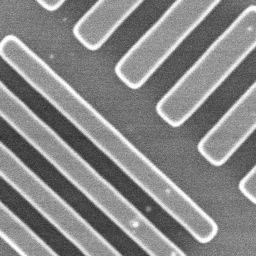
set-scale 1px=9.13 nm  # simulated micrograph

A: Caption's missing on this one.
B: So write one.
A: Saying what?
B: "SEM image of groups of lines, slits or small figures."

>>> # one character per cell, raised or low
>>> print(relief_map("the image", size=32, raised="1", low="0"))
00000111000011111000001111100000
00000000000111110000011111000001
00000000001111100000111110000011
00000000011111000001111100000111
00000000001111000011111000001111
11100000000110000111110000011111
11110000000000001111100000111110
01111000000000011111000001111100
00111100000000011111000011111000
00011110000000011110000111110000
00001111000000001100001111100000
10000111100000000000011111000001
11000011110000000000111111000011
11100001111000000000111110000111
11110000111100000000111100001111
01111100011111000000000000011111
00111110001111100000000000111110
00011111000111110000000001111100
10000111100011111000000001111100
11000011110000111100000000111000
11100001111000011110000000000000
11110000111100001111000000000001
01111000011110000111100000000011
00111100001111000011110000000011
00011110000111100001111000000001
00001111000011110000111100000000
10000111100001111000011110000000
11000011110000111100001111000000
11110001111000011110000111100000
11111000111110001111000011100000
01111100011111000111110000000000
00111110001111100011111000000000